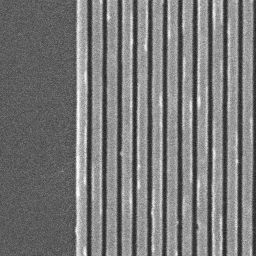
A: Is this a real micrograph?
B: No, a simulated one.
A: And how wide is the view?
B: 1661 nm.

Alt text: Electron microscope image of parallel lines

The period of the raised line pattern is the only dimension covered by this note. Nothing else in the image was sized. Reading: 97.8 nm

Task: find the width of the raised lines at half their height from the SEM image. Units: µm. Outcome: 0.0592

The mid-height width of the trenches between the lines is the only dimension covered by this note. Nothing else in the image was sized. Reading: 35.7 nm